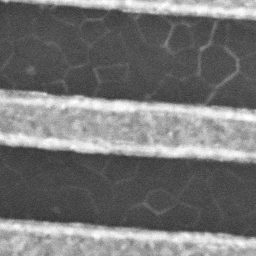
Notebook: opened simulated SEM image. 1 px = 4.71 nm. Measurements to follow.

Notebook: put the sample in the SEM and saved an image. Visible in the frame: one or a few lines or trenches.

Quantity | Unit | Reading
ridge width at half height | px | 40.6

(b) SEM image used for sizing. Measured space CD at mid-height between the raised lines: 411 nm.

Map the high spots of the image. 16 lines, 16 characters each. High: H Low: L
LLLLLLLLLLLHHHHH
LLLLLLLLLLLLLLLL
LLLLLLLLLLLLLLLL
LLLLLLLLLLLLLLLL
LLLLLLLLLLLLLLLL
LLLLLLLLLLLLLLLL
HHHHHHLLLLLLLLLL
HHHHHHHHHHHHHHHH
HHHHHHHHHHHHHHHH
LLLLLLLLLLLLLHHH
LLLLLLLLLLLLLLLL
LLLLLLLLLLLLLLLL
LLLLLLLLLLLLLLLL
LLLLLLLLLLLLLLLL
HHHHHLLLLLLLLLLL
HHHHHHHHHHHHHHHH